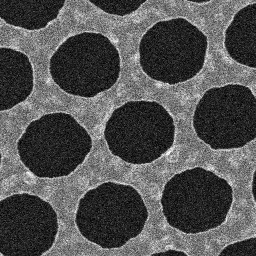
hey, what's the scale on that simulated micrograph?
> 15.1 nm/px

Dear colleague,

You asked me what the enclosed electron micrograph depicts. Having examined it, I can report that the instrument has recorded holes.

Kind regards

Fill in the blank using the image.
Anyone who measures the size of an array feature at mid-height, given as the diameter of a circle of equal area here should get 1020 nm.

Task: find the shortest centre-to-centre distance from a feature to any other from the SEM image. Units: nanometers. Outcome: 1300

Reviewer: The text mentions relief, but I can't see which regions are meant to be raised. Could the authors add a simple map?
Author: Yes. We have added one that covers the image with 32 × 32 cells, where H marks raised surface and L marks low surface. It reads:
LLLLLLLLHHHHLLLLLLHHHHHHHHHHHHHH
LLLLLLLHHHHHHLLLLHHHHHHHHHHHHHLL
LLLLLLLHHHHHHHHHHHHHHLLHHHHHHLLL
HHHLLHHHHHHHHHHHHHHLLLLLLHHHLLLL
HHHHHHHHHLLLLHHHHHLLLLLLLLHHLLLL
HHHHHHHHLLLLLLHHHLLLLLLLLLHHLLLL
LLLHHHHLLLLLLLLHHLLLLLLLLLHHLLLL
LLLLHHLLLLLLLLLHHLLLLLLLLLHHHLLL
LLLLHHLLLLLLLLLHHHLLLLLLLHHHHHHH
LLLLHHLLLLLLLLLHHHHLLLLLHHHHHHHH
LLLLHHHLLLLLLLHHHHHHHLHHHHHHHHHH
LLLLHHHHLLLLLHHHHHHHHHHHHHLLLLLH
LLLHHHHHHHHHHHHHHHHHHHHHHLLLLLLL
LHHHHHHHHHHHHHHLLLLLLHHHLLLLLLLL
HHHHHLLLLHHHHHLLLLLLLHHHLLLLLLLL
HHHHLLLLLLHHHLLLLLLLLLHHLLLLLLLL
HHHLLLLLLLLHHLLLLLLLLLHHLLLLLLLL
HHLLLLLLLLLHHLLLLLLLLLHHHLLLLLLL
HHLLLLLLLLLHHHLLLLLLLHHHHHLLLLHH
HHLLLLLLLLLHHHLLLLLLHHHHHHHHHHHH
HHHLLLLLLLHHHHHHHLHHHHHHHHHHHHHH
HHHHLLLLLHHHHHHHHHHHHHHLLLLHHHHH
HHHHHHHHHHHHHHHHHHHHHLLLLLLLHHHH
HHHHHHHHHHHHLLLLLHHHLLLLLLLLLHHL
HLLLLHHHHHLLLLLLLLHHLLLLLLLLLHHH
LLLLLLHHHHLLLLLLLLHHLLLLLLLLLHHH
LLLLLLLHHHLLLLLLLLHHLLLLLLLLLHHH
LLLLLLLHHLLLLLLLLLHHHLLLLLLLHHHH
LLLLLLLHHHLLLLLLLLHHHHLLLLLHHHHH
LLLLLLLHHHLLLLLLLHHHHHHHHHHHHHHH
LLLLLLLHHHHHLLLLHHHHHHHHHHHHHLLL
LLLLLLHHHHHHHHHHHHHHLLLHHHHHLLLL